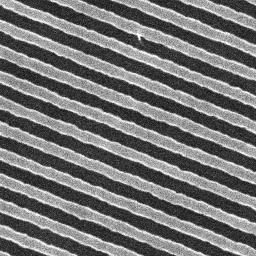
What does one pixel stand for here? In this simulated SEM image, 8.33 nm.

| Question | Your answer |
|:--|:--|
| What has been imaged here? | parallel lines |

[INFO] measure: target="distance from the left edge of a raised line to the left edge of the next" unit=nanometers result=198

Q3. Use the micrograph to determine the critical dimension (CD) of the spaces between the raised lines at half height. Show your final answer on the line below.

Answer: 110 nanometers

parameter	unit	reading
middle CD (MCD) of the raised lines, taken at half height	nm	85.1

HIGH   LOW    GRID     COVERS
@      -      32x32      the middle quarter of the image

-----@@@@@@@@---------@@@@@@@---
--------@@@@@@@----------@@@@@@-
@@--------@@@@@@@@---------@@@@@
@@@@----------@@@@@@----------@@
@@@@@@@---------@@@@@@@---------
--@@@@@@@----------@@@@@@@------
-----@@@@@@@---------@@@@@@@----
-------@@@@@@@@--------@@@@@@@--
---------@@@@@@@@---------@@@@@@
@@@---------@@@@@@@----------@@@
@@@@@@--------@@@@@@@@---------@
-@@@@@@@@---------@@@@@@@-------
----@@@@@@@---------@@@@@@@-----
------@@@@@@@@--------@@@@@@@@--
---------@@@@@@@---------@@@@@@@
@@@---------@@@@@@@---------@@@@
@@@@----------@@@@@@@---------@@
@@@@@@@---------@@@@@@@@--------
---@@@@@@@---------@@@@@@@------
-----@@@@@@@----------@@@@@@----
--------@@@@@@@---------@@@@@@@-
@----------@@@@@@---------@@@@@@
@@@@---------@@@@@@@---------@@@
@@@@@@---------@@@@@@@---------@
--@@@@@@@----------@@@@@@-------
----@@@@@@@----------@@@@@@-----
-------@@@@@@----------@@@@@@---
@---------@@@@@@----------@@@@@@
@@----------@@@@@@@---------@@@@
@@@@@----------@@@@@@----------@
-@@@@@@@---------@@@@@@@--------
---@@@@@@@----------@@@@@@------